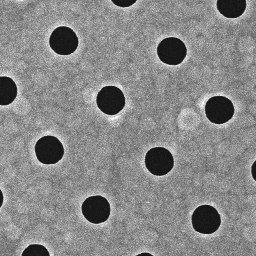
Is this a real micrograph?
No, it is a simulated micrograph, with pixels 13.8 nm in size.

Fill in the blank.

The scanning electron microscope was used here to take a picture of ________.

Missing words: a regular array of holes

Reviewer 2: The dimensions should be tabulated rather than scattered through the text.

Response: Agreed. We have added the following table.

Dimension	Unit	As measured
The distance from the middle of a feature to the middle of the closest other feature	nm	1040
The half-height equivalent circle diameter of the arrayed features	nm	402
